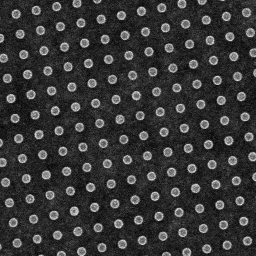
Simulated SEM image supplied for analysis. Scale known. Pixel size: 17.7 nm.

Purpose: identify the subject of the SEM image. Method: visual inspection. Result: a regular array of raised bodies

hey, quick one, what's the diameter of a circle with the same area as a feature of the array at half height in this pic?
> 158 nanometers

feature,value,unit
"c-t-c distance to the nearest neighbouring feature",360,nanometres